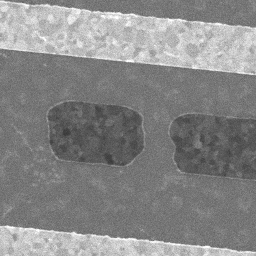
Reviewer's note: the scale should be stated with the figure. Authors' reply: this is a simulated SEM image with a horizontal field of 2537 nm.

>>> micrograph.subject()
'one or a few lines or trenches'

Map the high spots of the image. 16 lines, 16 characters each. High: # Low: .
####............
##############..
################
.....###########
..............##
................
....###.........
...######..#####
...######..#####
...######..#####
...........#####
................
................
................
####............
#############...